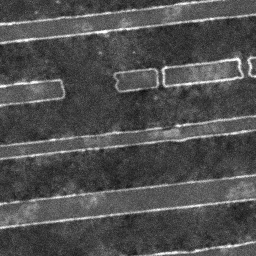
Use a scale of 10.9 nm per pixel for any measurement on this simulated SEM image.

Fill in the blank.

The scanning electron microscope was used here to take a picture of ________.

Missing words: one or a few lines or trenches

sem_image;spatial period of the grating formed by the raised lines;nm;645